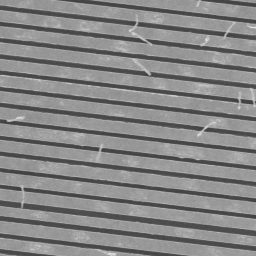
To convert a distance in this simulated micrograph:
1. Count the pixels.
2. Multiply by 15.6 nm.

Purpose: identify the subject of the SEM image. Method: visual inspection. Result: parallel lines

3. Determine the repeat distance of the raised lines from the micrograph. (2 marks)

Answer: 252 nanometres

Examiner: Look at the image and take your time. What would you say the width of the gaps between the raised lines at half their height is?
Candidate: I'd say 4.35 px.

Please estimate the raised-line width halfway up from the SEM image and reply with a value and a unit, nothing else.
0.176 micrometres